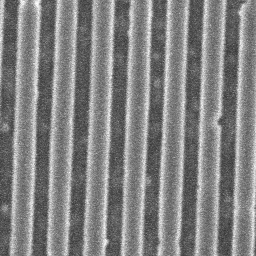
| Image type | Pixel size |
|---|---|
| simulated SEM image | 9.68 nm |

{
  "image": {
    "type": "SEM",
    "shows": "parallel lines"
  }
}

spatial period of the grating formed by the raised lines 358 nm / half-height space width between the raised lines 162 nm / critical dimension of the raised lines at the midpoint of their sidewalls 189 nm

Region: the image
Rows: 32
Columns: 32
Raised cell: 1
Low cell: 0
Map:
00011001110011001110011000110001
00111001110011001110011000110011
00111001100011001110011000110011
00111001100011001110011000110011
00111001100011001110011001110011
00111001100011001110011001110011
00111001100011001110011001110011
00111001100111001110011001110011
00111001100111001110011001110011
00110001100111001110011001110011
00110001100111001100011001110011
00111001100111001100011001110011
00110001100111001100011001110011
00110001100111001100011001110011
00110001100111001100011001100011
00110001100111001100111001100011
00110001100111001100111001100011
00110011100111001100111001100011
00110011100111001100111001100011
00110011100110001100111001100011
00110011100110001100111001100011
00110011100110001100111001100011
00110011100110001100111001100011
00110011100110001100111001100111
00110011100110001100111001100111
00110011100110011100111001100111
00110011000110011100111001100111
00110011100110011100110001100111
00110011100110011100110001100111
00110011000110011100110001100111
01110011000110011100110001100111
01110011001110011100110001100111